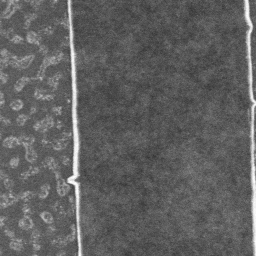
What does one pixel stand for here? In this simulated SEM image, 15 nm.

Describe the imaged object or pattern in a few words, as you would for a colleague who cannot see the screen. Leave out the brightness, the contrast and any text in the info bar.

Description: one or a few lines or trenches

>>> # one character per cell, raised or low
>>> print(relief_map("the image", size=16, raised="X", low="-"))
----XXXXXXXXXXX-
----XXXXXXXXXXXX
----XXXXXXXXXXXX
-----XXXXXXXXXXX
-----XXXXXXXXXXX
-----XXXXXXXXXXX
-----XXXXXXXXXXX
-----XXXXXXXXXXX
-----XXXXXXXXXXX
-----XXXXXXXXXXX
-----XXXXXXXXXXX
-----XXXXXXXXXXX
-----XXXXXXXXXXX
-----XXXXXXXXXXX
-----XXXXXXXXXXX
-----XXXXXXXXXXX